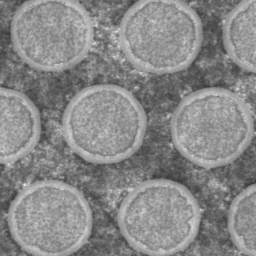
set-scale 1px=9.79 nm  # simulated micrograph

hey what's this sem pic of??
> raised bodies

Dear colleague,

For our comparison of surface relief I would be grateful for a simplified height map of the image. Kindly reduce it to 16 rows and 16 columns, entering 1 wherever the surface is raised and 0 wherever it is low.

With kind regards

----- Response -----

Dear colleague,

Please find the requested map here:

0111100011110001
0111110011110011
0111110011110011
0111100011110001
0000000000000000
0000001000000000
1100011110011110
1100111110011111
1100111110011111
1100011100011110
0000000000000000
0011000001100000
0111100011110001
0111110011110011
0111100011110001
0011100001100001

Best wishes